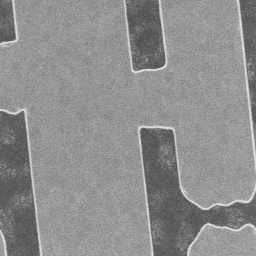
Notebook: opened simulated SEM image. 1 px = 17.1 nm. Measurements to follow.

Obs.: one or a few lines or trenches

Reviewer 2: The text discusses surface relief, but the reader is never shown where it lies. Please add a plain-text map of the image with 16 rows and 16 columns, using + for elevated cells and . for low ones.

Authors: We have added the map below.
.+++++++..+++++.
.+++++++..+++++.
.+++++++..+++++.
++++++++..+++++.
+++++++++++++++.
+++++++++++++++.
++++++++++++++++
..++++++++++++++
..+++++++..+++++
..+++++++..+++++
..+++++++..+++++
..+++++++..+++++
..+++++++...+++.
..+++++++.......
..+++++++....+++
...+++++++..++++